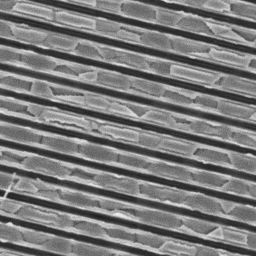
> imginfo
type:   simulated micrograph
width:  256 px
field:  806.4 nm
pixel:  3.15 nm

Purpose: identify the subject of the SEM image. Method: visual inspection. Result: parallel lines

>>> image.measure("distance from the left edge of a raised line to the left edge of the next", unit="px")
24.7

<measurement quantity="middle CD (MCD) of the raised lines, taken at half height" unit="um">0.0578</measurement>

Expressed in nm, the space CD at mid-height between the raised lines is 21.5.